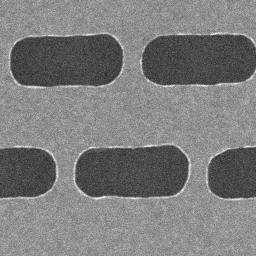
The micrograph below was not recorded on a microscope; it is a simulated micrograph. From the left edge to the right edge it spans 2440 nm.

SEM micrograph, holes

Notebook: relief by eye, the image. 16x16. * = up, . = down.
****************
****************
*......***......
*.......*.......
*.......*.......
****************
****************
****************
****************
...**......***..
...**.......*...
...**.......*...
****************
****************
****************
****************